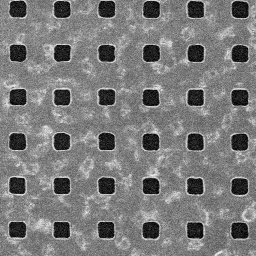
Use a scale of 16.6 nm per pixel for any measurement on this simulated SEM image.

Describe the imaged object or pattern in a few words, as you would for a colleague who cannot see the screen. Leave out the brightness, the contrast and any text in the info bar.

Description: a regular array of holes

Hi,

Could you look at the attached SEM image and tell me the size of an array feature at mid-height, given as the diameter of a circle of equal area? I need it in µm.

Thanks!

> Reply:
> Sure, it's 0.307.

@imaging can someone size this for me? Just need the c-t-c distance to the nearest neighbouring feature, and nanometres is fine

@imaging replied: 732